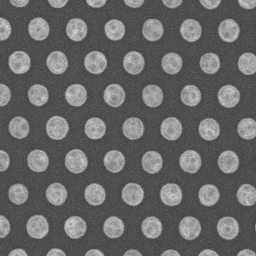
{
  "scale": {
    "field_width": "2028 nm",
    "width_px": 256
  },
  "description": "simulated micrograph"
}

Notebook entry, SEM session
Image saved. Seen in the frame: a regular array of raised bodies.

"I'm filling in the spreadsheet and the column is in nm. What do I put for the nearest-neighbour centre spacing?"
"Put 299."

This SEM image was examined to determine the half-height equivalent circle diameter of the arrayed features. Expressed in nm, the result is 165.